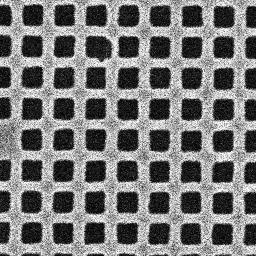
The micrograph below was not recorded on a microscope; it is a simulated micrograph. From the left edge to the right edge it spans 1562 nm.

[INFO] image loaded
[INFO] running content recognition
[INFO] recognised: a regular array of holes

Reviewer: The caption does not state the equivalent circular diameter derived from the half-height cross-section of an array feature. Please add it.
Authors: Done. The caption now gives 144 nanometers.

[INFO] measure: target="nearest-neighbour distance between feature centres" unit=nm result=188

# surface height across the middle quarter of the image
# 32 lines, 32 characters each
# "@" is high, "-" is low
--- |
@@@@@@@@@@@@@@@@@@@@@@@@@@@@@@@@
---@@@-----@@@-----@@@-----@@---
---@@------@@@-----@@------@@---
---@@------@@------@@------@@---
---@@------@@------@@------@@---
---@@-----@@@------@@@-----@@---
@@@@@@@@@@@@@@@@@@@@@@@@@@@@@@@-
@@@@@@@@@@@@@@@@@@@@@@@@@@@@@@@@
-@@@@@@---@@@@@@@@@@@@----@@@@--
---@@------@@------@@------@@---
---@@------@@------@@------@@---
---@@------@@------@@------@@---
---@@------@@------@@------@@---
---@@-----@@@@----@@@-----@@@---
@@@@@@@@@@@@@@@@@@@@@@@@@@@@@@@@
@@@@@@@@@@@@@@@@@@@@@@@@@@@@@@@@
--@@@@----@@@@@---@@@@----@@@@-@
---@@------@@@-----@@------@@---
--@@@------@@------@@------@@---
--@@@------@@------@@------@@---
---@@-----@@@------@@-----@@@---
--@@@@----@@@@----@@@@----@@@---
@@@@@@@@@@@@@@@@@@@@@@@@@@@@@@@@
@@@@@@@@@@@@@@@@@@@@@@@@@@@@@@@@
--@@@@----@@@-----@@@@----@@@@--
---@@------@@------@@------@@---
---@@------@@------@@------@@---
--@@@------@@------@@------@@---
--@@@-----@@@-----@@@------@@---
-@@@@@---@@@@@@@@@@@@@----@@@@--
@@@@@@@@@@@@@@@@@@@@@@@@@@@@@@@@
@@@@@@@@@@@@@@@@@@@@@@@@@@@@@@@@